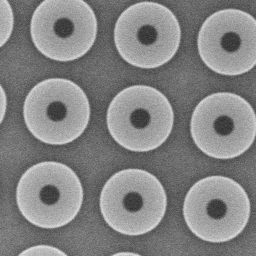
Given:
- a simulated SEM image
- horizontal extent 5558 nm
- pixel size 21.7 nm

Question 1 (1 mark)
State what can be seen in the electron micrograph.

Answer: an array of small figures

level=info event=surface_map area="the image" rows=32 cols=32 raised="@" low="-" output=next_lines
@----@@@@@@------@@@------------
@---@@@@@@@@----@@@@@------@@@--
@@--@@@@@@@@---@@@@@@@----@@@@@@
@---@@@@@@@@--@@@@@@@@---@@@@@@@
@---@@@@@@@@--@@@@@@@@---@@@@@@@
----@@@@@@@@--@@@@@@@@---@@@@@@@
-----@@@@@@----@@@@@@@---@@@@@@@
-------@@-------@@@@@----@@@@@@@
--------------------------@@@@@-
--------------------------------
-----@@@@-----------------------
----@@@@@@-----@@@@@------------
@--@@@@@@@@---@@@@@@@----@@@@@--
@--@@@@@@@@---@@@@@@@----@@@@@@-
---@@@@@@@@--@@@@@@@@@--@@@@@@@@
---@@@@@@@@--@@@@@@@@@--@@@@@@@@
----@@@@@@----@@@@@@@---@@@@@@@@
-----@@@@-----@@@@@@@---@@@@@@@@
----------------@@@------@@@@@@-
--------------------------@@@---
-----@@@------------------------
---@@@@@@------@@@--------------
---@@@@@@@----@@@@@@-----@@@@---
--@@@@@@@@---@@@@@@@----@@@@@@--
--@@@@@@@@---@@@@@@@@--@@@@@@@@-
--@@@@@@@@---@@@@@@@@--@@@@@@@@-
---@@@@@@@---@@@@@@@@--@@@@@@@@-
----@@@@@----@@@@@@@---@@@@@@@@-
--------------@@@@@-----@@@@@@--
-------------------------@@@@---
--------------------------------
---@@@@@------------------------